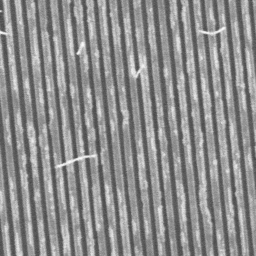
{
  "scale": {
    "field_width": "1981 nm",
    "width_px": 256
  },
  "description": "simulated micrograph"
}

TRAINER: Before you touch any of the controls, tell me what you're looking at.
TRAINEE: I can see parallel lines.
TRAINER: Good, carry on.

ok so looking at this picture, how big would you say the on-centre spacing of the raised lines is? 91.7 nm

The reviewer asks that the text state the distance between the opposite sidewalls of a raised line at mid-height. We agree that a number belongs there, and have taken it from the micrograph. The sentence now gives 51.9 nm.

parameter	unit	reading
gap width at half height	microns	0.0452